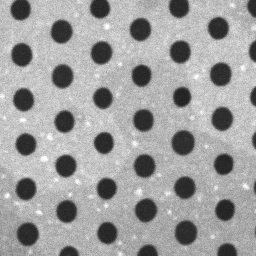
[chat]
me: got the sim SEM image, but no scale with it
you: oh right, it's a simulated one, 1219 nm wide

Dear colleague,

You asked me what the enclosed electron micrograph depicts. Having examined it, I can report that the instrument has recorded a regular array of holes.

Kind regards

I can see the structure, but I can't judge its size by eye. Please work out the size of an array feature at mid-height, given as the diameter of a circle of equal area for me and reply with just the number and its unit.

0.105 microns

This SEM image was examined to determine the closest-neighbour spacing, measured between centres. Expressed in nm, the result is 213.